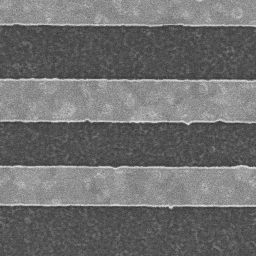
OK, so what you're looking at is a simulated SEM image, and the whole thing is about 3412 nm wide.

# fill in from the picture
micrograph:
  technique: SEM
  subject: one or a few lines or trenches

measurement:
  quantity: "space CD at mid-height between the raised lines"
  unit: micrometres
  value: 0.676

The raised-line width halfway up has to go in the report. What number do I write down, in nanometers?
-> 530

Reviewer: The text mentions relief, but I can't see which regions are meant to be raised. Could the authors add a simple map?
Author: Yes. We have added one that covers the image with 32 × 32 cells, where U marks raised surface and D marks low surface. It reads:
UUUUUUUUUUUUUUUUUUUUUUUUUUUUUUUU
UUUUUUUUUUUUUUUUUUUUUUUUUUUUUUUU
UUUUUUUUUUUUUUUUUUUUUUUUUUUUUUUU
DDDDDDDDDDDDDDDDDDDDDDDDDDDDDDDD
DDDDDDDDDDDDDDDDDDDDDDDDDDDDDDDD
DDDDDDDDDDDDDDDDDDDDDDDDDDDDDDDD
DDDDDDDDDDDDDDDDDDDDDDDDDDDDDDDD
DDDDDDDDDDDDDDDDDDDDDDDDDDDDDDDD
DDDDDDDDDDDDDDDDDDDDDDDDDDDDDDDD
DDDDDDDDDDDDDDDDDDDDDDDDDDDDDDDD
UUUUUUUUUUUUUUUUUUUUUUUUUUUUUUUU
UUUUUUUUUUUUUUUUUUUUUUUUUUUUUUUU
UUUUUUUUUUUUUUUUUUUUUUUUUUUUUUUU
UUUUUUUUUUUUUUUUUUUUUUUUUUUUUUUU
UUUUUUUUUUUUUUUUUUUUUUUUUUUUUUUU
DDDDDDDDDDDDDDDDDDDDDDDDDDDDDDDD
DDDDDDDDDDDDDDDDDDDDDDDDDDDDDDDD
DDDDDDDDDDDDDDDDDDDDDDDDDDDDDDDD
DDDDDDDDDDDDDDDDDDDDDDDDDDDDDDDD
DDDDDDDDDDDDDDDDDDDDDDDDDDDDDDDD
DDDDDDDDDDDDDDDDDDDDDDDDDDDDDDDD
UUUUUUUUUUUUUUUUUUUUUUUUUUUUUUUU
UUUUUUUUUUUUUUUUUUUUUUUUUUUUUUUU
UUUUUUUUUUUUUUUUUUUUUUUUUUUUUUUU
UUUUUUUUUUUUUUUUUUUUUUUUUUUUUUUU
UUUUUUUUUUUUUUUUUUUUUUUUUUUUUUUU
DDDDDDDDDDDDDDDDDDDDDDDDDDDDDDDD
DDDDDDDDDDDDDDDDDDDDDDDDDDDDDDDD
DDDDDDDDDDDDDDDDDDDDDDDDDDDDDDDD
DDDDDDDDDDDDDDDDDDDDDDDDDDDDDDDD
DDDDDDDDDDDDDDDDDDDDDDDDDDDDDDDD
DDDDDDDDDDDDDDDDDDDDDDDDDDDDDDDD